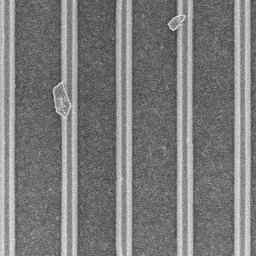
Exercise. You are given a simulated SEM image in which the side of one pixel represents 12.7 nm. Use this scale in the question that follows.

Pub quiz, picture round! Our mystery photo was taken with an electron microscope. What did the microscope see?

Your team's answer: parallel lines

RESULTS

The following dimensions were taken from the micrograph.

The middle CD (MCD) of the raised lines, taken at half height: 0.141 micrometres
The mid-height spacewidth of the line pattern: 47.2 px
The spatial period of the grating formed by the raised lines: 747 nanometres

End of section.